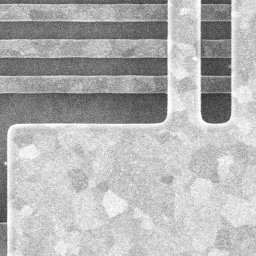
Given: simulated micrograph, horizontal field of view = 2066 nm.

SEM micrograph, wiring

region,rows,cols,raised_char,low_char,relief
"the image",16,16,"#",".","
...........##..#
...........##..#
...........##..#
...........##..#
...........##..#
...........##..#
...........##..#
..........###.##
.###############
.###############
.###############
.###############
.###############
.###############
.###############
.###############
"